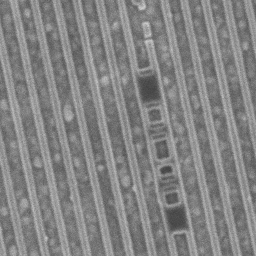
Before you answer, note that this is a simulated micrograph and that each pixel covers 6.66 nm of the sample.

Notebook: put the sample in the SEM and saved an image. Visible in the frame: parallel lines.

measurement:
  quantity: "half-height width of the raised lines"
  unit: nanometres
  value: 40.7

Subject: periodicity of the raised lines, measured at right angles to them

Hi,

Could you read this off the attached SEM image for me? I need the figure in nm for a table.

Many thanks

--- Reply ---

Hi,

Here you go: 139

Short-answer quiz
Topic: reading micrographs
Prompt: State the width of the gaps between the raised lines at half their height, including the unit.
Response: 97.7 nm